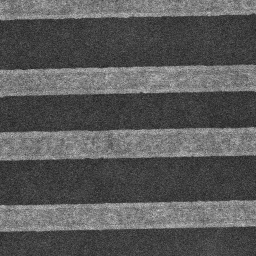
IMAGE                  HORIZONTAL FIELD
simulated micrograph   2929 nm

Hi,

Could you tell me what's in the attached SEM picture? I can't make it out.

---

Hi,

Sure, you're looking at one or a few lines or trenches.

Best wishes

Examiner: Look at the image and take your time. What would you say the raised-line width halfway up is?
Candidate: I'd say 257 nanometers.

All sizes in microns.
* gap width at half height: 0.556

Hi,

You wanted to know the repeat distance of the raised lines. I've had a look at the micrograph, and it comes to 0.776 um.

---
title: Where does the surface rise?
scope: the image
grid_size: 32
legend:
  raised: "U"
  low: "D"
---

UUUUUUUUUUUUUUUUUUUUUUUUUUUUUUUU
UUUUUUUUUUUUUUUUUUUUUUUUUUUUUUUU
DDDDDDDDDDDDDDDDDDDDDDDDDDDDDDDD
DDDDDDDDDDDDDDDDDDDDDDDDDDDDDDDD
DDDDDDDDDDDDDDDDDDDDDDDDDDDDDDDD
DDDDDDDDDDDDDDDDDDDDDDDDDDDDDDDD
DDDDDDDDDDDDDDDDDDDDDDDDDDDDDDDD
DDDDDDDDDDDDDDDDDDDDDDDDDDDDDDDD
DDDDDDDDDDDDDDDDDDDDDDDUUDDUUUUU
UUUUUUUUUUUUUUUUUUUUUUUUUUUUUUUU
UUUUUUUUUUUUUUUUUUUUUUUUUUUUUUUU
UUUUUUDUDUDUDDDDDDDDDDDDDDDDDDDD
DDDDDDDDDDDDDDDDDDDDDDDDDDDDDDDD
DDDDDDDDDDDDDDDDDDDDDDDDDDDDDDDD
DDDDDDDDDDDDDDDDDDDDDDDDDDDDDDDD
DDDDDDDDDDDDDDDDDDDDDDDDDDDDDDDD
DDDDDDDDDDDDDDDUUDUUUUUUUUUUUUUU
UUUUUUUUUUUUUUUUUUUUUUUUUUUUUUUU
UUUUUUUUUUUUUUUUUUUUUUUUUUUUUUUU
UUUUUUUUUUUUUUUDDDDDDDDDDDDDDDDD
DDDDDDDDDDDDDDDDDDDDDDDDDDDDDDDD
DDDDDDDDDDDDDDDDDDDDDDDDDDDDDDDD
DDDDDDDDDDDDDDDDDDDDDDDDDDDDDDDD
DDDDDDDDDDDDDDDDDDDDDDDDDDDDDDDD
DDDDDDDDDDDDDDDDDDDDDDDDDDDDDDDD
DDDDDDDDDDDDDDDDDDDDDDDDUUUUUUUU
UUUUUUUUUUUUUUUUUUUUUUUUUUUUUUUU
UUUUUUUUUUUUUUUUUUUUUUUUUUUUUUUU
UUUUUUUUUDDDDDDDDDDDDDDDDDDDDDDD
DDDDDDDDDDDDDDDDDDDDDDDDDDDDDDDD
DDDDDDDDDDDDDDDDDDDDDDDDDDDDDDDD
DDDDDDDDDDDDDDDDDDDDDDDDDDDDDDDD